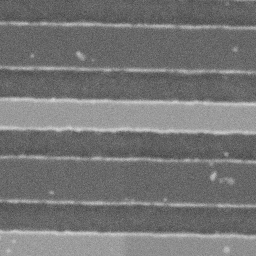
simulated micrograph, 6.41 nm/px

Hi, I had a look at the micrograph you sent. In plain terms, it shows lines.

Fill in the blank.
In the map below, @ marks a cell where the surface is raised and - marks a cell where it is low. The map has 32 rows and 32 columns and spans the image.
--------------------------------
--------------------------------
--------------------------------
@@@@@@@@@@@@@@@@@@@@@@@@@@@@@@@@
@@@@@@@@@@@@@@@@@@@@@@@@@@@@@@@@
@@@@@@@@@@@@@@@@@@@@@@@@@@@@@@@@
@@@@@@@@@@@@@@@@@@@@@@@@@@@@@@@@
@@@@@@@@@@@@@@@@@@@@@@@@@@@@@@@@
-@@@-@@@@@@@@@@@@@@@@@@@@@@@@@@@
--------------------------------
--------------------------------
--------------------------------
@@@@@@@@@-----------------------
@@@@@@@@@@@@@@@@@@@@@@@@@@@@@@@@
@@@@@@@@@@@@@@@@@@@@@@@@@@@@@@@@
@@@@@@@@@@@@@@@@@@@@@@@@@@@@@@@@
--------------------@--@@@@@@@@@
--------------------------------
--------------------------------
--------------------------------
@@@@@@@@@@@@@@@@@@@@@@@@@@@@@@@@
@@@@@@@@@@@@@@@@@@@@@@@@@@@@@@@@
@@@@@@@@@@@@@@@@@@@@@@@@@@@@@@@@
@@@@@@@@@@@@@@@@@@@@@@@@@@@@@@@@
@@@@@@@@@@@@@@@@@@@@@@@@@@@@@@@@
------------------@@@@@@@@@@@@@@
--------------------------------
--------------------------------
--------------------------------
@@@@@@@@@@@@@@@@@@@@@@@@@@@@@@@-
@@@@@@@@@@@@@@@@@@@@@@@@@@@@@@@@
@@@@@@@@@@@@@@@@@@@@@@@@@@@@@@@@